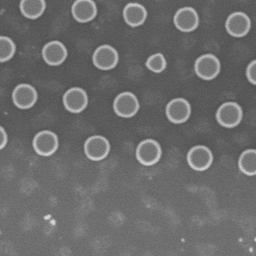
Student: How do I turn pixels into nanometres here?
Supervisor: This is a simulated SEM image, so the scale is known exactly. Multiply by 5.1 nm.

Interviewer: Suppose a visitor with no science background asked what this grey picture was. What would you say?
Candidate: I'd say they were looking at a regular array of raised bodies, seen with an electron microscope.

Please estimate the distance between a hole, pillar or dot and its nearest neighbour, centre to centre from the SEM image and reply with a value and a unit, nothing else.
261 nm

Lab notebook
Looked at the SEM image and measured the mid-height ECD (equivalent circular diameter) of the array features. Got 122 nm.